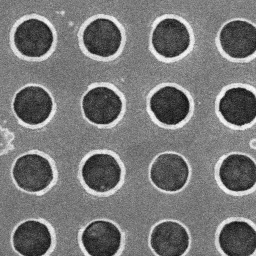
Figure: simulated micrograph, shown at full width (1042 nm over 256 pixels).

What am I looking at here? a regular array of holes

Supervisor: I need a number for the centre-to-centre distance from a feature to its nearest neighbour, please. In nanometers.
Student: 274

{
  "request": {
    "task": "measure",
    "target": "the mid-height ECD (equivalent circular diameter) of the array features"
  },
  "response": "0.162 microns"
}